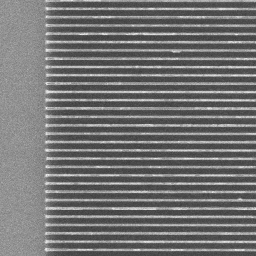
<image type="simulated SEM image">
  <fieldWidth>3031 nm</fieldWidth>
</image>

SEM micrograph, parallel lines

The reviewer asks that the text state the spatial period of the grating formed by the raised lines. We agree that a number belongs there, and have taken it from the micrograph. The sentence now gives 98.4 nanometres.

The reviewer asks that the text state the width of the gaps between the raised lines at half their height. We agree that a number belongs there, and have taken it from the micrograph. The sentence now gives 71.1 nm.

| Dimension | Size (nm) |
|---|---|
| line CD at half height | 23.7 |